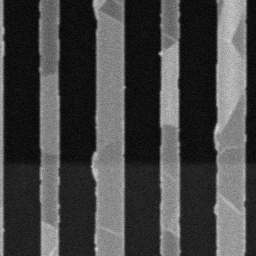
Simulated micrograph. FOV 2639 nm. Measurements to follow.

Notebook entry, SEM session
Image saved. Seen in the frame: lines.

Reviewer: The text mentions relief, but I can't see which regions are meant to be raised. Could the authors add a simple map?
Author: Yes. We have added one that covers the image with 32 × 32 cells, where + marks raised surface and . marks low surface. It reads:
.....++.....+++.....++.....++++.
.....++.....+++.....++.....++++.
.....++.....+++.....++.....++++.
.....++.....+++.....++.....++++.
.....++.....+++.....++.....++++.
.....++.....+++.....++.....++++.
.....++.....+++.....++.....++++.
.....++.....+++.....++.....++++.
.....++.....+++.....++.....++++.
.....++.....+++.....++.....++++.
.....++.....+++.....++.....++++.
.....++.....+++.....++.....++++.
.....++.....+++.....++.....++++.
.....++.....+++.....++.....++++.
.....++.....+++.....++.....++++.
.....++.....+++.....++.....++++.
.....++.....+++.....++.....++++.
.....++.....+++.....++.....++++.
.....++.....+++.....++.....++++.
.....++.....+++.....++.....++++.
.....++.....+++.....++.....++++.
.....++.....+++.....++.....++++.
.....++.....+++.....++.....++++.
.....++.....+++.....++.....++++.
.....++.....+++.....++.....++++.
.....++.....+++.....++.....++++.
.....++.....+++.....++.....++++.
.....++.....+++.....++.....++++.
.....++.....+++.....++.....++++.
.....++.....+++.....++.....++++.
.....++.....+++.....++.....++++.
.....++.....+++.....++.....++++.